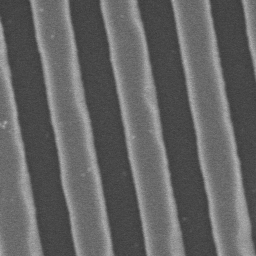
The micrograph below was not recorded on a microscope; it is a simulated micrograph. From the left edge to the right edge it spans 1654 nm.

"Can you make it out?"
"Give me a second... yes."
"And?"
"lines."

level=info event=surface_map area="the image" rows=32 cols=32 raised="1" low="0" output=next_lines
00001111000001111000001111000011
00001111100001111000001111000001
00001111100001111000001111000001
00001111100001111100001111100001
00001111100001111100001111100001
10000111100000111100001111100001
10000111100000111100000111100001
10000111110000111110000111100000
10000111110000111110000111110000
10000011110000111110000111110000
10000011110000111110000111110000
11000011110000011110000111110000
11000011110000011110000011110000
11000011111000011111000011111000
11000011111000011111000011111000
11000011111000011111000011111000
11000001111000001111000011111000
11100001111100001111000001111000
11100001111100001111100001111000
11100001111100001111100001111100
11100001111100001111100001111100
11100000111100001111100001111100
11110000111110000111100001111100
11110000111110000111100000111100
11110000111110000111110000111100
11110000111110000111110000111110
11110000011110000111110000111110
11110000011110000011110000111110
11111000011111000011110000011110
11111000011111000011110000011110
11111000011111000011111000011110
11111000011111000011111000011111